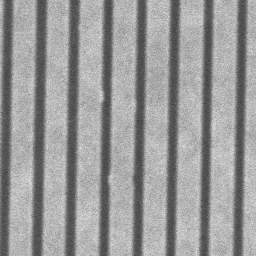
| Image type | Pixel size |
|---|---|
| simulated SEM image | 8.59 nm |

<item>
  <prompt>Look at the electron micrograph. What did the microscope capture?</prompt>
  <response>parallel lines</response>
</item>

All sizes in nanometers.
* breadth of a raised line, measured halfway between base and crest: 193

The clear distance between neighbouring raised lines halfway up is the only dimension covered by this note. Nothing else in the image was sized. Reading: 10.9 px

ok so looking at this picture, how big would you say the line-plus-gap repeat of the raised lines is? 287 nm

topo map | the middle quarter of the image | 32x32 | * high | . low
*...*****...******...*****...***
*...*****...******...*****...***
*...*****...******...*****...***
*...*****...******...*****...***
*...*****...******...*****...***
*...*****...******...*****...***
*...*****...******...*****...***
*...******..******..******...***
*...******..******..******...***
*...*****...******..******...***
*...*****...******..******...***
*...*****...******..******...***
*...*****...*****...******...***
*...*****...*****...******...***
*...*****...*****...******...***
*...*****...*****...******...***
....*****...*****...******...***
....*****...*****...******...***
....*****...*****...******...***
....*****...*****...******...***
....*****...*****...******...***
....*****...*****...******...***
....*****...*****...******...***
....*****...*****...******...***
...******...*****...******...***
...******...*****...******...***
...******...*****...******..****
...******...*****...******..****
...******..******...*****...****
...******..******...*****...****
...******...*****...*****...****
...******...*****...*****...****